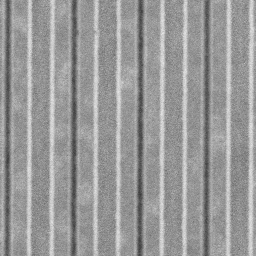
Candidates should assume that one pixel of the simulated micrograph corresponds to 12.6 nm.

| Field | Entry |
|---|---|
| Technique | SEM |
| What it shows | parallel lines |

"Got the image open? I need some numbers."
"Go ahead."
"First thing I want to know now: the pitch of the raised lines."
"417 nanometers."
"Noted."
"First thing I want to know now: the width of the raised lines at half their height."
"226 nm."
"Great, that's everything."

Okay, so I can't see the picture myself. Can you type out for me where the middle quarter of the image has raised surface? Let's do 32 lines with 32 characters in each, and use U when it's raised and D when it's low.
UUDUUUUUDDDDDDUUUUDDUUUUUDDDDDUU
UUDUUUUUDDDDDDUUUUDDUUUUUDDDDDUU
UUDUUUUUDDDDDDUUUUDDUUUUDDDDDDUU
UUDUUUUUDDDDDDUUUUDDUUUUDDDDDDUU
UUDUUUUUDDDDDDUUUUDDUUUUDDDDDDUU
UUDUUUUUDDDDDDUUUUDDUUUUUDDDDDUU
UUDUUUUUDDDDDDUUUUDDUUUUDDDDDDUU
UUDUUUUUDDDDDDUUUUDDUUUUUDDDDDUU
UUDUUUUUDDDDDDUUUUDDUUUUUDDDDDUU
UUDUUUUUDDDDDDUUUUDDUUUUUDDDDDUU
UUDUUUUUDDDDDDUUUUDDUUUUUDDDDDUU
UDDUUUUUDDDDDDUUUUDDUUUUUDDDDDUU
UDDUUUUUDDDDDDUUUUDDUUUUUDDDDDUU
UDDUUUUUDDDDDDUUUUDDUUUUUDDDDDUU
UDDUUUUUDDDDDDUUUUDDUUUUUDDDDDUU
UDDUUUUUDDDDDDUUUUDDUUUUUDDDDDUU
UDDUUUUUDDDDDDUUUUDDUUUUUDDDDDUU
UDDUUUUUDDDDDDUUUUDDUUUUDDDDDDUU
UDDUUUUUDDDDDDUUUUDDUUUUDDDDDDUU
UDDUUUUUDDDDDDUUUUDDUUUUDDDDDDUU
UDDUUUUUDDDDDDUUUUDDUUUUDDDDDDUU
UDDUUUUUDDDDDDUUUUDDUUUUDDDDDDUU
UDDUUUUUDDDDDDUUUUDDUUUUDDDDDDUU
UDDUUUUUDDDDDDUUUUDDUUUUDDDDDDUU
UDDUUUUUDDDDDDUUUUDDUUUUDDDDDDUU
UDDUUUUUDDDDDDUUUUDDUUUUDDDDDDUU
UDDUUUUUDDDDDDUUUUDDUUUUDDDDDDUU
UDDUUUUUDDDDDDUUUUDDUUUUDDDDDDUU
UDDUUUUUDDDDDDUUUUDDUUUUDDDDDDUU
UDDUUUUUDDDDDDUUUUDDUUUUDDDDDDUU
UDDUUUUUDDDDDDUUUUDDUUUUDDDDDDUU
UDDUUUUUDDDDDDUUUUDDUUUUDDDDDDUU